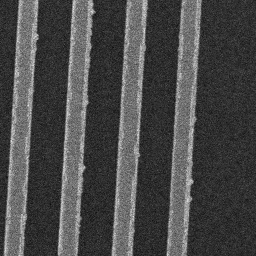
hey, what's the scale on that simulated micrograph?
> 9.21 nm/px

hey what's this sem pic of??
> parallel lines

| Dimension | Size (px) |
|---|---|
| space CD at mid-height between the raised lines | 35.7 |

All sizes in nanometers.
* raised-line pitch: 500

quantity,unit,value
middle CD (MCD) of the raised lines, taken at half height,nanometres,169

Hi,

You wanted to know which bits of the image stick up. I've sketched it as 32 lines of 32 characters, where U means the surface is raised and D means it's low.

DDUUUDDDDUUUDDDDUUDDDDDUUDDDDDDD
DDUUUDDDDUUUDDDDUUDDDDDUUDDDDDDD
DDUUUDDDDUUDDDDDUUDDDDDUUDDDDDDD
DDUUUDDDDUUDDDDDUUDDDDDUUDDDDDDD
DDUUUDDDDUUDDDDDUUDDDDUUUDDDDDDD
DDUUDDDDDUUDDDDDUUDDDDUUUDDDDDDD
DDUUUDDDDUUDDDDDUUDDDDUUUDDDDDDD
DDUUDDDDDUUDDDDDUUDDDDUUUDDDDDDD
DDUUDDDDDUUDDDDDUUDDDDUUUDDDDDDD
DDUUDDDDDUUDDDDDUUDDDDUUDDDDDDDD
DDUUDDDDDUUDDDDUUUDDDDUUDDDDDDDD
DDUUDDDDDUUDDDDUUUDDDDUUDDDDDDDD
DDUUDDDDUUUDDDDUUUDDDDUUDDDDDDDD
DDUUDDDDUUUDDDDUUDDDDDUUDDDDDDDD
DDUUDDDDUUUDDDDUUDDDDDUUDDDDDDDD
DDUUDDDDUUUDDDDUUDDDDDUUDDDDDDDD
DDUUDDDDUUUDDDDUUDDDDDUUDDDDDDDD
DUUUDDDDUUDDDDDUUDDDDDUUDDDDDDDD
DUUUDDDDUUDDDDDUUDDDDDUUDDDDDDDD
DUUUDDDDUUDDDDDUUDDDDDUUDDDDDDDD
DUUDDDDDUUDDDDDUUDDDDDUUDDDDDDDD
DUUDDDDDUUDDDDDUUDDDDDUUDDDDDDDD
DUUDDDDDUUDDDDDUUDDDDDUUDDDDDDDD
DUUDDDDDUUDDDDDUUDDDDUUUDDDDDDDD
DUUDDDDDUUDDDDDUUDDDDUUUDDDDDDDD
DUUDDDDDUUDDDDDUUDDDDUUUDDDDDDDD
DUUDDDDDUUDDDDUUUDDDDUUUDDDDDDDD
DUUDDDDDUUDDDDUUUDDDDUUUDDDDDDDD
DUUDDDDDUUDDDDUUUDDDDUUDDDDDDDDD
DUUDDDDUUUDDDDUUUDDDDUUDDDDDDDDD
DUUDDDDUUUDDDDUUUDDDDUUDDDDDDDDD
DUUDDDDUUUDDDDUUDDDDDUUDDDDDDDDD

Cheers